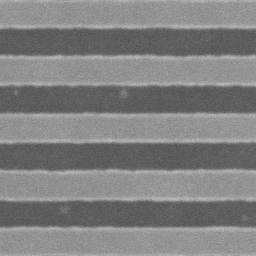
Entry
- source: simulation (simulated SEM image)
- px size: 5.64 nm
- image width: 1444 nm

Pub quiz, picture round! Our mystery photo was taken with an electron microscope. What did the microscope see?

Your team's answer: lines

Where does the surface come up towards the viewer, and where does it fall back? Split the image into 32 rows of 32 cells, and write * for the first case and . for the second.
********************************
********************************
********************************
................................
................................
................................
................................
********************************
********************************
********************************
********************************
................................
................................
................................
********************************
********************************
********************************
********************************
................................
................................
................................
********************************
********************************
********************************
********************************
................................
................................
................................
..********..**...........*****..
********************************
********************************
********************************